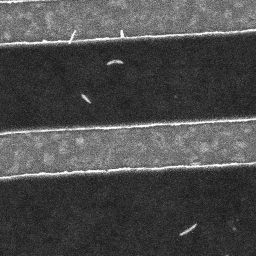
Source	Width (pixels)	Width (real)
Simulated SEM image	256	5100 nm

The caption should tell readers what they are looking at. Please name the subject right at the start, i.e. one or a few lines or trenches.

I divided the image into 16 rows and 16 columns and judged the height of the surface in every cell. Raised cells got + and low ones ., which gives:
................
................
.....+++++++++++
++++++++++++++++
++++++++++++++++
++++++++++++++++
++++++++++++++++
++++++++++++++++
................
................
..........++++++
++++++++++++++++
++++++++++++++++
++++++++++++++++
++++++++++++++++
++++++++++++++++